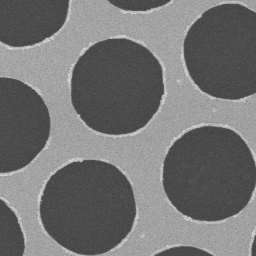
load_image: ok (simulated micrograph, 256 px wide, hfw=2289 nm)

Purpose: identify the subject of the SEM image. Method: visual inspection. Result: holes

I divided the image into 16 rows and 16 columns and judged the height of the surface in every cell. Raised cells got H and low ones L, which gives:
LLLLHHHLLLHHHLLH
LLLLHHHHHHHHLLLL
LLLHHHHLHHHHLLLL
HHHHHLLLLLHHLLLL
HHHHHLLLLLHHLLLL
LLHHLLLLLLHHLLLL
LLLHHLLLLLHHHHHH
LLLHHLLLLHHHHHHH
LLLHHHHHHHHLLLLH
LLHHHHHHHHHLLLLL
LHHHLLLHHHLLLLLL
HHHLLLLLHHLLLLLL
HHHLLLLLHHHLLLLL
LHHLLLLLHHHHLLHH
LHHLLLLLHHHHHHHH
LLHHLLLHHHHLHHHH